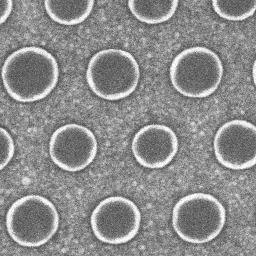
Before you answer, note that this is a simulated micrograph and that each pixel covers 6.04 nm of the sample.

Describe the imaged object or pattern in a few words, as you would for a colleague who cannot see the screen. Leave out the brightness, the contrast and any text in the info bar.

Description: a regular array of raised bodies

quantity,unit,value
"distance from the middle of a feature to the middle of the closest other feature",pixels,82.8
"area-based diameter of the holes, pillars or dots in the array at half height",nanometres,300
